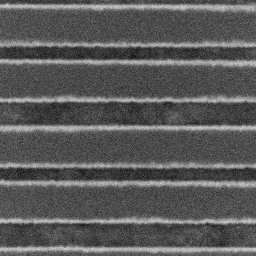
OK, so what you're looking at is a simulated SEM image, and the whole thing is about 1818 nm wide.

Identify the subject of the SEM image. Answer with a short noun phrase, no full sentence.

lines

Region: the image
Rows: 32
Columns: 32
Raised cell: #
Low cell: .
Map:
................................
################################
################################
################################
################################
################################
................................
................................
################################
################################
################################
################################
#########.######################
................................
................................
................................
################################
################################
################################
################################
################################
................................
................................
################################
################################
################################
################################
################################
................................
................................
................................
################################